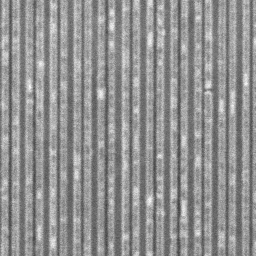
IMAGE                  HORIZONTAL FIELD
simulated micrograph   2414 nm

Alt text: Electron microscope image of parallel lines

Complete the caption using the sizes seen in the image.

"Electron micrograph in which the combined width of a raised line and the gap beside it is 114 nm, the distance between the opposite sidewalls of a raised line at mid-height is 5.87 pixels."